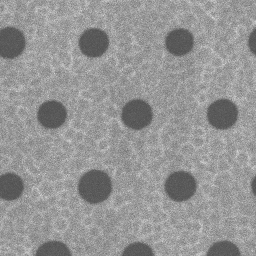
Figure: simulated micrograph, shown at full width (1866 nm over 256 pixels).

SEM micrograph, holes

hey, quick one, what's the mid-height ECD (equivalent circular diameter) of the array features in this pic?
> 226 nm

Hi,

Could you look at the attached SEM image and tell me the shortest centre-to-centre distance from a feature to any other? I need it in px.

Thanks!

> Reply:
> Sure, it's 83.2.